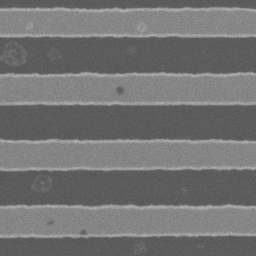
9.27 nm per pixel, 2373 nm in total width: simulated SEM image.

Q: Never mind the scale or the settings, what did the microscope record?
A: lines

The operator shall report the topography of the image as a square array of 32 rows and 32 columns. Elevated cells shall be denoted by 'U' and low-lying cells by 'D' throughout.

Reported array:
DDDDDDDDDDDDDDDDDDDDDDDDDDDDDDDD
UUUUUUUUUUUUUUUUUUUUUUUUUUUUUUUU
UUUUUUUUUUUUUUUUUUUUUUUUUUUUUUUU
UUUUUUUUUUUUUUUUUUUUUUUUUUUUUUUU
UUUDUDDUUUUUDDUUUUUDUDUUUDUDUUUD
DDDDDDDDDDDDDDDDDDDDDDDDDDDDDDDD
DDDDDDDDDDDDDDDDDDDDDDDDDDDDDDDD
DDDDDDDDDDDDDDDDDDDDDDDDDDDDDDDD
DDDDDDDDDDDDDDDDDDDDDDDDDDDDDDDD
UUUUUUUUUUUUUUUUUUUUUUUUUUUUUUUU
UUUUUUUUUUUUUUUUUUUUUUUUUUUUUUUU
UUUUUUUUUUUUUUUUUUUUUUUUUUUUUUUU
UUUUUUUUUUUUUUUUUUUUUUUUUUUUUUUU
DDDDDDDDDDDDDDDDDDDDDDDDDDDDDDDD
DDDDDDDDDDDDDDDDDDDDDDDDDDDDDDDD
DDDDDDDDDDDDDDDDDDDDDDDDDDDDDDDD
DDDDDDDDDDDDDDDDDDDDDDDDDDDDDDDD
DDDDDDUDDDDDDDDDDDDUUDDDDDUDDDDD
UUUUUUUUUUUUUUUUUUUUUUUUUUUUUUUU
UUUUUUUUUUUUUUUUUUUUUUUUUUUUUUUU
UUUUUUUUUUUUUUUUUUUUUUUUUUUUUUUU
DDDDDDDDDDDDDDDDDDDDDDDDDDDDDDDD
DDDDDDDDDDDDDDDDDDDDDDDDDDDDDDDD
DDDDDDDDDDDDDDDDDDDDDDDDDDDDDDDD
DDDDDDDDDDDDDDDDDDDDDDDDDDDDDDDD
DDDDDDDDDDDDDDDDDDDDDDDDDDDDDDDD
UUUUUUUUUUUUUUUUUUUUUUUUUUUUUUUU
UUUUUUUUUUUUUUUUUUUUUUUUUUUUUUUU
UUUUUUUUUUUUUUUUUUUUUUUUUUUUUUUU
UUUUUUUUUUUUUUUDUUUDDDUDDDDDDDDD
DDDDDDDDDDDDDDDDDDDDDDDDDDDDDDDD
DDDDDDDDDDDDDDDDDDDDDDDDDDDDDDDD